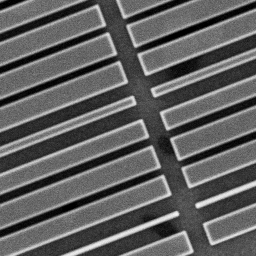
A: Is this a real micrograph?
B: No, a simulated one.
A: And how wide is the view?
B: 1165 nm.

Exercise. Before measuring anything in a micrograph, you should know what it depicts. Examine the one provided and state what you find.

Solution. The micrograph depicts groups of lines, slits or small figures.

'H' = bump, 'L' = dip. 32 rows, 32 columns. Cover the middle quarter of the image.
HHHHHHLLLLLHHHLLLLLLHHHHHHLLLLLL
HHHLLLLLHHHHHHHLLLLLHHHHLLLLLLLL
LLLLLHHHHHHHHHHLLLLLLLLLLLLLLLLH
LLLHHHHHHHHHHHHLLLLLLLLLLLLLLHHH
HHHHHHHHHHHHHHHHLLLLLLLLLLHHHHHH
HHHHHHHHHHHHHLLLLLLLLLLLHHHHHLLL
HHHHHHHHHHHLLLLLLLLLLLHHHHHLLLLL
HHHHHHHHLLLLLLLLLLLLLLHHLLLLLLLL
HHHHHHLLLLLLLLLLHLLLLLLLLLLLLLLL
HHHLLLLLLLLLLHHHHHLLLLLLLLLLLLLH
LLLLLLLLLLLHHHHHHLLLLLLLLLLLHHHH
LLLLLLLLHHHHHHLLLLLLLLLLLLHHHHHH
LLLLLLHHHHHLLLLLLLLLLLLLHHHHHHHH
LLLHHHHHHLLLLLLLLLLLLLLLLHHHHHHH
LHHHHHLLLLLLLLLLLLHHLLLLLHHHHHHL
HHHHLLLLLLLLLLLHHHHHLLLLLHHHLLLL
HLLLLLLLLLLLLHHHHHHHLLLLLLLLLLLL
LLLLLLLLLLHHHHHHHHHHHLLLLLLLLLHH
LLLLLLLLHHHHHHHHHHHHHLLLLLLHHHHH
LLLLLHHHHHHHHHHHHHLLLLLLLLLHHHHH
LLHHHHHHHHHHHHHLLLLLLLLLLLLHHHHH
HHHHHHHHHHHHHLLLLLLLHHLLLLLLHHHH
HHHHHHHHHHLLLLLLLHHHHHHLLLLLHHHH
HHHHHHHHLLLLLLHHHHHHHHHLLLLLLHLL
HHHHHLLLLLLLHHHHHHHHHHHHLLLLLLLL
HHLLLLLLLHHHHHHHHHHHHHHHLLLLLLLH
LLLLLLLHHHHHHHHHHHHHHHHLLLLLLLHH
LLLLHHHHHHHHHHHHHHHHLLLLLLLLLLHH
LHHHHHHHHHHHHHHHHLLLLLLHHLLLLLLH
HHHHHHHHHHHHHHHLLLLLLHHHHHLLLLLH
HHHHHHHHHHHHLLLLLLHHHHHHHHLLLLLH
HHHHHHHHHLLLLLLHHHHHHHHHHHLLLLLL